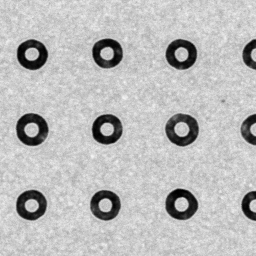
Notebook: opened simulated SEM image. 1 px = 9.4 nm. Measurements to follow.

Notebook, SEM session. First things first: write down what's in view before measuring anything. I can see a regular array of ring-shaped grooves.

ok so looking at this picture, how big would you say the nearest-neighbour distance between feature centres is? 702 nanometers